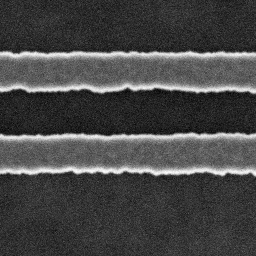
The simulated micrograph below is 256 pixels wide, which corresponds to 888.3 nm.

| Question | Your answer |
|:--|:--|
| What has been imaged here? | lines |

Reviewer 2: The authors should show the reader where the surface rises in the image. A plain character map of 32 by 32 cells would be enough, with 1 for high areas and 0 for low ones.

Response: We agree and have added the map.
00000000000000000000000000000000
00000000000000000000000000000000
00000000000000000000000000000000
00000000000000000000000000000000
00000000000000000000000000000000
00000000000000000000000000000000
00000000000000000000000000000000
11111111111111111111111111111111
11111111111111111111111111111111
11111111111111111111111111111111
11111111111111111111111111111111
00000000000010000000000011000001
00000000000000000000000000000000
00000000000000000000000000000000
00000000000000000000000000000000
00000000000000000000000000000000
00000000000000000000000000000000
11111111111111111111111111111111
11111111111111111111111111111111
11111111111111111111111111111111
11111111111111111111111111111111
11111111011101101101111110111111
00000000000000000000000000000000
00000000000000000000000000000000
00000000000000000000000000000000
00000000000000000000000000000000
00000000000000000000000000000000
00000000000000000000000000000000
00000000000000000000000000000000
00000000000000000000000000000000
00000000000000000000000000000000
00000000000000000000000000000000